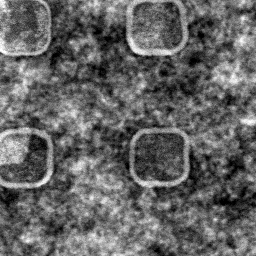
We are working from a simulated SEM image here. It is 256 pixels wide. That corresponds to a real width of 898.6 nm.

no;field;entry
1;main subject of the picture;raised bodies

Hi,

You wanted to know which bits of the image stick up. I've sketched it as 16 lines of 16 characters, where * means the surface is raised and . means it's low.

*.......***.....
***.....****....
***.....***.....
................
................
................
................
................
***......**.....
***.....****....
***.....****....
**..............
................
................
................
................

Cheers